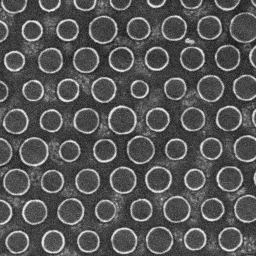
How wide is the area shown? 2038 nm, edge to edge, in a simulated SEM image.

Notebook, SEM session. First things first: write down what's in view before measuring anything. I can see a regular array of raised bodies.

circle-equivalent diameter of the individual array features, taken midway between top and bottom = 0.187 microns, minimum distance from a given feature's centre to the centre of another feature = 277 nm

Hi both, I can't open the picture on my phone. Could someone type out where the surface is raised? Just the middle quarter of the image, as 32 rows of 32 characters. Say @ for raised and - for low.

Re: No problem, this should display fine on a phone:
---@@@@@----@@@@@----@@@@-----@@
----@@@------@@@----------------
--------------------------------
--------------------------------
@@@-----@@@@------@@------@@@@--
@@@----@@@@@@----@@@@----@@@@@--
@@@----@@@@@@----@@@@----@@@@@--
@@@----@@@@@@----@@@@-----@@@@--
@@@-----@@@@---------------@@---
---------@@---------------------
--------------------------------
----@@@-----@@@@@-----@@@------@
---@@@@@----@@@@@@---@@@@@----@@
---@@@@@---@@@@@@@---@@@@@---@@@
---@@@@@@--@@@@@@@---@@@@@----@@
---@@@@@----@@@@@@---@@@@@----@@
----@@@@----@@@@@-----@@-------@
--------------------------------
------------------@@@-----------
@@@------@@@----@@@@@@----@@@@--
@@@@----@@@@@---@@@@@@----@@@@--
@@@@---@@@@@@---@@@@@@@---@@@@--
@@@@----@@@@@---@@@@@@----@@@@--
@@@-----@@@@-----@@@@@-----@@---
------------------@@------------
--------------------------------
-----@@------@@@@-----@@@@------
----@@@@----@@@@@@---@@@@@-----@
---@@@@@@---@@@@@@---@@@@@@---@@
---@@@@@@---@@@@@@---@@@@@@---@@
---@@@@@@---@@@@@@---@@@@@-----@
----@@@@-----@@@@-----@@@-------